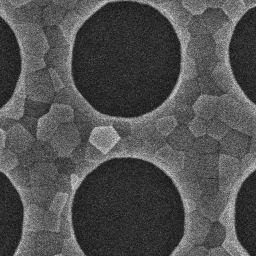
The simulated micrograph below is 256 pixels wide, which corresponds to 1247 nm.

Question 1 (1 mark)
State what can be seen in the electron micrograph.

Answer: holes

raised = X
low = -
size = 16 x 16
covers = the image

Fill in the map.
XXXXXX----XXXXXX
-XXXX------XXXX-
-XXXX------XXX--
-XXXX------XXX--
-XXX-------XXX--
-XXXX------XXXX-
XXXXXX----XXXXXX
XXXXXXXXXXXXXXXX
XXXXXXXXXXXXXXXX
XXXXXXXXXXXXXXXX
XXXXXX----XXXXXX
-XXXX------XXXX-
-XXXX------XXXX-
-XXX--------XXX-
-XXXX-------XXX-
-XXXX------XXXX-